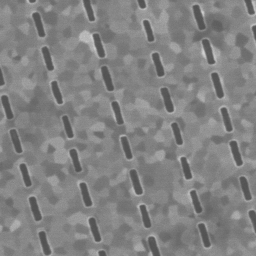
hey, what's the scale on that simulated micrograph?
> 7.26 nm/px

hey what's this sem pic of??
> a regular array of holes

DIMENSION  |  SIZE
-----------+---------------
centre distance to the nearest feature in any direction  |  256 nanometers